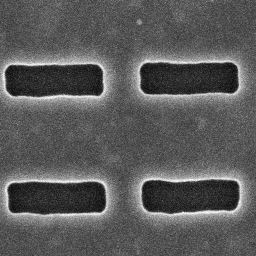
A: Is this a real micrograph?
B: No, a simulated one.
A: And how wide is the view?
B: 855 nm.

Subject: holes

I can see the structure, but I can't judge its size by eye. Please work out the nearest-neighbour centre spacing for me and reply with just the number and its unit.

0.393 µm